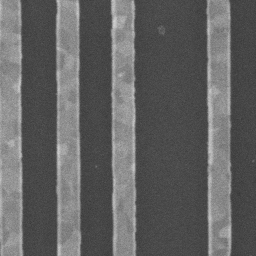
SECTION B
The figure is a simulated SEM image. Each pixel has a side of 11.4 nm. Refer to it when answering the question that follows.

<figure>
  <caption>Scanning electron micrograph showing lines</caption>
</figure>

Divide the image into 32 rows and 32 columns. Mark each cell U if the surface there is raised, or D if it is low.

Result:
UUDDDDDUUUDDDDUUUDDDDDDDDDUUUDDD
UUDDDDDUUUDDDDUUUDDDDDDDDDUUUDDD
UUDDDDDUUUDDDDUUUDDDDDDDDDUUUDDD
UUDDDDDUUUDDDDUUUDDDDDDDDDUUUDDD
UUDDDDDUUUDDDDUUUDDDDDDDDDUUUDDD
UUDDDDDUUUDDDDUUUDDDDDDDDDUUUDDD
UUUDDDDUUUDDDDUUUDDDDDDDDDUUUDDD
UUUDDDDUUUDDDDUUUDDDDDDDDDUUUDDD
UUUDDDDUUUDDDDUUUDDDDDDDDDUUUDDD
UUUDDDDUUUDDDDUUUDDDDDDDDDUUUDDD
UUDDDDDUUUDDDDUUUDDDDDDDDDUUUDDD
UUDDDDDUUUDDDDUUUDDDDDDDDDUUUDDD
UUDDDDDUUUDDDDUUUDDDDDDDDDUUUDDD
UUDDDDDUUUDDDDUUUDDDDDDDDDUUUDDD
UUDDDDDUUUDDDDUUUDDDDDDDDDUUUDDD
UUDDDDDUUUDDDDUUUDDDDDDDDDUUUDDD
UUDDDDDUUUDDDDUUUDDDDDDDDDUUUDDD
UUDDDDDUUUDDDDUUUDDDDDDDDDUUUDDD
UUDDDDDUUUDDDDUUUDDDDDDDDDUUUDDD
UUUDDDDUUUDDDDUUUDDDDDDDDDUUUDDD
UUUDDDDUUUDDDDUUUDDDDDDDDDUUUDDD
UUUDDDDUUUDDDDUUUDDDDDDDDDUUUDDD
UUUDDDDUUUDDDDUUUDDDDDDDDDUUUDDD
UUUDDDDUUUDDDDUUUDDDDDDDDDUUUDDD
UUUDDDDUUUDDDDUUUDDDDDDDDDUUUDDD
UUUDDDDUUUDDDDUUUDDDDDDDDDUUUDDD
UUUDDDDUUUDDDDUUUDDDDDDDDDUUUDDD
UUUDDDDUUUDDDDUUUDDDDDDDDDUUUDDD
UUUDDDDUUUDDDDUUUDDDDDDDDDUUUDDD
UUUDDDDUUUDDDDUUUDDDDDDDDDUUUDDD
UUUDDDDUUUDDDDUUUDDDDDDDDDUUUDDD
UUUDDDDUUUDDDDUUUDDDDDDDDDUUUDDD